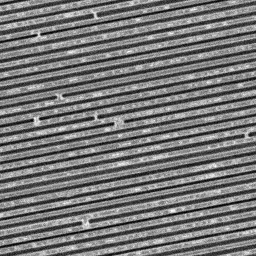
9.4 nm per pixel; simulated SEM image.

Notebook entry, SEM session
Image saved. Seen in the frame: parallel lines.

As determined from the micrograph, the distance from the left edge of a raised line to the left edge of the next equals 86.1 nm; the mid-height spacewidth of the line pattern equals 41.6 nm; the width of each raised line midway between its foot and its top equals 4.43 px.